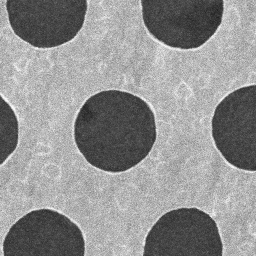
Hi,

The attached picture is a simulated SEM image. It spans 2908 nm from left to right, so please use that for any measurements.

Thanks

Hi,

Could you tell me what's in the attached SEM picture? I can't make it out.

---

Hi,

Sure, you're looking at holes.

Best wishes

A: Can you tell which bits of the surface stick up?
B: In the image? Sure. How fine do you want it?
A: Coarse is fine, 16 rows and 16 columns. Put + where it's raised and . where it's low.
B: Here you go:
.....++++.....++
+....++++.....++
+...++++++...+++
++++++++++++++++
++++++++++++++++
+++++++++++++++.
+++++....+++++..
.++++.....+++...
.++++.....+++...
.++++....+++++..
++++++..+++++++.
++++++++++++++++
++++++++++++++++
+...++++++...+++
.....++++.....++
.....++++.....++